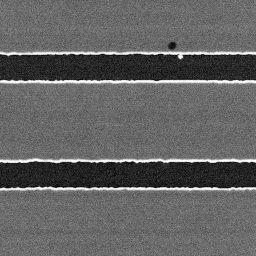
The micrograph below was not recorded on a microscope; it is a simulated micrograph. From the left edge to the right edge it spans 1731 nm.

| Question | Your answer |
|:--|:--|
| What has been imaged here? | lines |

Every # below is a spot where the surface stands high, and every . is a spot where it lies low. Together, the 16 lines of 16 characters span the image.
################
################
################
................
................
################
################
################
################
################
................
................
################
################
################
################